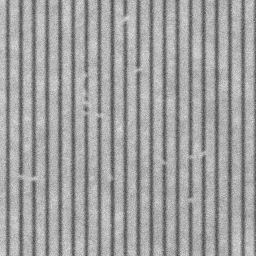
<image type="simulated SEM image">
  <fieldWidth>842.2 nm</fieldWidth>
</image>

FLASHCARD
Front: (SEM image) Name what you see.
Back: parallel lines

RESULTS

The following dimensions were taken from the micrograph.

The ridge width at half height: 0.0312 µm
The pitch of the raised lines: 43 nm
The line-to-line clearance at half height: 0.0115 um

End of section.